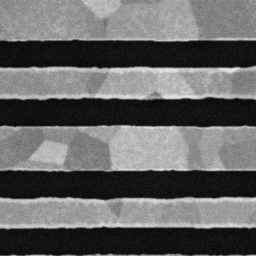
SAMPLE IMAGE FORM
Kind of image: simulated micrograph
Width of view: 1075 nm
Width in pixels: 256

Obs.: lines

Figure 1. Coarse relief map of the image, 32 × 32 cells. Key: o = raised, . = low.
oooooooooooooooooooooooooooooooo
oooooooooooooooooooooooooooooooo
oooooooooooooooooooooooooooooooo
oooooooooooooooooooooooooooooooo
oooooooooooooooooooooooooooooooo
................................
................................
................................
....o.oooo.......oo............o
oooooooooooooooooooooooooooooooo
oooooooooooooooooooooooooooooooo
oooooooooooooooooooooooooooooooo
................................
................................
................................
................................
oooooooooooooooooooooooooooooooo
oooooooooooooooooooooooooooooooo
oooooooooooooooooooooooooooooooo
oooooooooooooooooooooooooooooooo
oooooooooooooooooooooooooooooooo
................................
................................
................................
................................
oooooooooooooooooooooooooooooooo
oooooooooooooooooooooooooooooooo
oooooooooooooooooooooooooooooooo
................................
................................
................................
................................